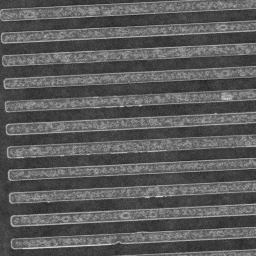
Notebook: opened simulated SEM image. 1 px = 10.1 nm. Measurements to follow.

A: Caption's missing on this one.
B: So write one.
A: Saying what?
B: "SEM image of parallel lines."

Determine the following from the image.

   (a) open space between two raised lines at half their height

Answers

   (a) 124 nm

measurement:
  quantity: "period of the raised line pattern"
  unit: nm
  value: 232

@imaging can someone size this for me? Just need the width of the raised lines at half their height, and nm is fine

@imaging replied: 106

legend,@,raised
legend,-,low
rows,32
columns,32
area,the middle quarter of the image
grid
--------------------------------
--------------------------------
------------@@@@@@@@@@@@@@@@@@@@
@@@@@@@@@@@@@@@@@@@@@@@@@@@@@@@@
@@@@@@@@@@@@@@@@@@@@@-----------
--------------------------------
--------------------------------
--------------------------@@@@@@
------@@@@@@@@@@@@@@@@@@@@@@@@@@
@@@@@@@@@@@@@@@@@@@@@@@@@@@@@@@@
@@@@@@@@@@@@@@------------------
--------------------------------
--------------------------------
--------------------@@@@@@@@@@@@
@@@@@@@@@@@@@@@@@@@@@@@@@@@@@@@@
@@@@@@@@@@@@@@@@@@@@@@@@@@@@----
@@@@@@@@------------------------
--------------------------------
--------------------------------
-------------@@@@@@@@@@@@@@@@@@@
@@@@@@@@@@@@@@@@@@@@@@@@@@@@@@@@
@@@@@@@@@@@@@@@@@@@@@@@@@@------
@@@@@@--------------------------
--------------------------------
--------------------------------
-----------@@@@@@@@@@@@@@@@@@@@@
@@@@@@@@@@@@@@@@@@@@@@@@@@@@@@@@
@@@@@@@@@@@@@@@-----------------
--------------------------------
--------------------------------
-------------------------@@@@@@@
-----@@@@@@@@@@@@@@@@@@@@@@@@@@@